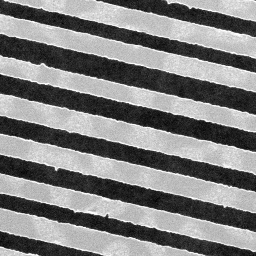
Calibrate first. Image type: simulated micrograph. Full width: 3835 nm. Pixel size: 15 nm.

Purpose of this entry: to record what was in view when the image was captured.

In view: parallel lines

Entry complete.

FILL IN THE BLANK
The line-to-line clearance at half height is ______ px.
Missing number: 18.2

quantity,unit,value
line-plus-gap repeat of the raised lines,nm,568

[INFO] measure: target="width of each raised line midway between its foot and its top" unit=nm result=290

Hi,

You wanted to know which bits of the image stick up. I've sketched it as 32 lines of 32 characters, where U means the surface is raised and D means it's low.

DDUUUUUUUUUUUUDDDDDDDDDUUUUUUUUU
DDDDDDDUUUUUUUUUUUDDDDDDDDDUUUUU
UUUDDDDDDDDUUUUUUUUUUUDDDDDDDDDU
UUUUUUUUDDDDDDDUUUUUUUUUUUUDDDDD
DUUUUUUUUUUUDDDDDDDDUUUUUUUUUDUD
DDDDDDUUUUUUUUUUDDDDDDDDUUUUUUUU
DDDDDDDDDDUUUUUUUUUUDDDDDDDDDUUU
UUDDDDDDDDDDDDDUUUUUUUUUUDDDDDDD
UUUUUUUDDDDDDDDDDDDUUUUUUUUUUDDD
DUUUUUUUUUUDDDDDDDDDDDDUUUUUUUUU
DDDDDUUUUUUUUUUDDDDDDDDDDDDDUUUU
DDDDDDDDDDUUUUUUUUUUDDDDDDDDDDDD
UUUDDDDDDDDDDDUUUUUUUUUUDDDDDDDD
UUUUUUUUDDDDDDDDDDDUUUUUUUUUDDDD
UUUUUUUUUUUUDDDDDDDDDDDUUUUUUUUU
DDDDDUUUUUUUUUUUDDDDDDDDDDDUUUUU
DDDDDDDDDUUUUUUUUUUUUDDDDDDDDDDD
UUUDDDDDDDDDDUUUUUUUUUUUUDDDDDDD
UUUUUUUUDDDDDDDDDDUUUUUUUUUUUUDD
DUUUUUUUUUUUDDDDDDDDDDUUUUUUUUUU
DDDDDDUUUUUUUUUUUDDDDDDDDDUUUUUU
DDDDDDDDDDUUUUUUUUUUUDDDDDDDDDDU
UUUDDDDDDDDDDDUUUUUUUUUUUDDDDDDD
UUUUUUUUDDDDDDDDDDUUUUUUUUUUUUDD
DDUUUUUUUUUUDDDDDDDDDDDUUUUUUUUU
DDDDDDUUUUUUDUUUUDDDDDDDDDDUUUUU
UUDDDDDDDDDDUUUUUUUUUDDDDDDDDDDU
UUUUUUDDDDDDDDDUUUUUUUUUUDDDDDDD
UUUUUUUUUUUDDDDDDDDUUUUUUUUUUDDD
DDDUUUUUUUUUUUUDDDDDDDDDUUUUUUUU
DDDDDDDUUUUUUUUUUUUDDDDDDDDDUUUU
UUUDDDDDDDDUUUUUUUUUUUUUDDDDDDDD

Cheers